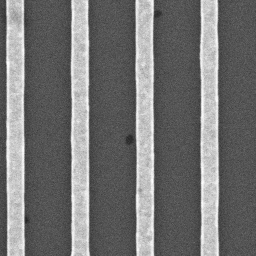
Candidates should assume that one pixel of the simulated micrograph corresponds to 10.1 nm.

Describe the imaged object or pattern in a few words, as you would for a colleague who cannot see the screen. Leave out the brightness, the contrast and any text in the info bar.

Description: wiring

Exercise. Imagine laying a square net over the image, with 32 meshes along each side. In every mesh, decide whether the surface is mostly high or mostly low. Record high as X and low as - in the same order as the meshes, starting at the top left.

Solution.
-XX------XX------XX------XX-----
-XX------XX------XX------XX-----
-XX------XX------XX------XX-----
-XX------XX------XX------XX-----
-XX------XX------XX------XX-----
-XX------XX------XX------XX-----
-XX------XX------XX------XX-----
-XX------XX------XX------XX-----
-XX------XX------XX------XX-----
-XX------XX------XX------XX-----
-XX------XX------XX------XX-----
-XX------XX------XX------XX-----
-XX------XX------XX------XX-----
-XX------XX------XX------XX-----
-XX------XX------XX------XX-----
-XX------XX------XX------XX-----
-XX------XX------XX------XX-----
-XX------XX------XX------XX-----
-XX------XX------XX------XX-----
-XX------XX------XX------XX-----
-XX------XX------XX------XX-----
-XX------XX------XX------XX-----
-XX------XX------XX------XX-----
-XX------XX------XX------XX-----
-XX------XX------XX------XX-----
-XX------XX------XX------XX-----
-XX------XX------XX------XX-----
-XX------XX------XX------XX-----
-XX------XX------XX------XX-----
-XX------XX------XX------XX-----
-XX------XX------XX------XX-----
-XX------XX------XX------XX-----